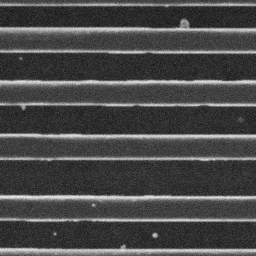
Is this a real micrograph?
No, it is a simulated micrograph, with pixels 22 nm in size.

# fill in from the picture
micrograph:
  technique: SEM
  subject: lines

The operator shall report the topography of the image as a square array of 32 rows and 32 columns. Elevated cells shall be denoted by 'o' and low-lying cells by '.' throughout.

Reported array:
oooooooooooooooooooooooooooooooo
................................
................................
................................
oooooooooooooooooooooooooooooooo
oooooooooooooooooooooooooooooooo
..............oooo.ooooooooooooo
................................
................................
................................
oooooooooooooooooooooooooooooooo
oooooooooooooooooooooooooooooooo
oooooooooooooooooooooooooooooooo
................................
................................
................................
................................
oooooooooooooooooooooooooooooooo
oooooooooooooooooooooooooooooooo
oooooooooooooooooooooooooooooooo
................................
................................
................................
................................
................................
oooooooooooooooooooooooooooooooo
oooooooooooooooooooooooooooooooo
....o.oo......oooooooooooooooooo
................................
................................
................................
oooooooooooooooooooooooooooooooo